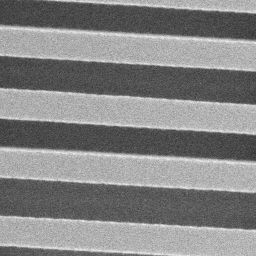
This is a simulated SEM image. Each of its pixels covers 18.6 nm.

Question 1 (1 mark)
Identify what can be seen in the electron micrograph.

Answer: lines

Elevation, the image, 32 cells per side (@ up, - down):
---------------@@@@@@@@@@@@@@@@@
-------------------------------@
--------------------------------
--------------------------------
@@@@@@@@@@@@@@@@@---------------
@@@@@@@@@@@@@@@@@@@@@@@@@@@@@@@@
@@@@@@@@@@@@@@@@@@@@@@@@@@@@@@@@
----------@@@@@@@@@@@@@@@@@@@@@@
---------------------------@@@@@
--------------------------------
--------------------------------
@@@@@@--------------------------
@@@@@@@@@@@@@@@@@@@@@-----------
@@@@@@@@@@@@@@@@@@@@@@@@@@@@@@@@
@@@@@@@@@@@@@@@@@@@@@@@@@@@@@@@@
-------------@@@@@@@@@@@@@@@@@@@
-----------------------------@@@
--------------------------------
--------------------------------
@@@@@@@@@@@@@@@@----------------
@@@@@@@@@@@@@@@@@@@@@@@@@@@@@@@-
@@@@@@@@@@@@@@@@@@@@@@@@@@@@@@@@
------@@@@@@@@@@@@@@@@@@@@@@@@@@
-----------------------@@@@@@@@@
--------------------------------
--------------------------------
--------------------------------
@@@@@@@@@-----------------------
@@@@@@@@@@@@@@@@@@@@@@@@@@@-----
@@@@@@@@@@@@@@@@@@@@@@@@@@@@@@@@
@@@@@@@@@@@@@@@@@@@@@@@@@@@@@@@@
----------------@@@@@@@@@@@@@@@@